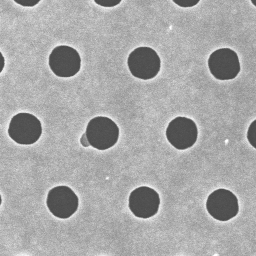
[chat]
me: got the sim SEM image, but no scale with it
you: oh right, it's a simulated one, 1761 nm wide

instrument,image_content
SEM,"a regular array of holes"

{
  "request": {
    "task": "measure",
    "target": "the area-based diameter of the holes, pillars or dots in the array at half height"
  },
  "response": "0.222 micrometres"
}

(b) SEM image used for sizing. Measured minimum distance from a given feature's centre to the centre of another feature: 539 nm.